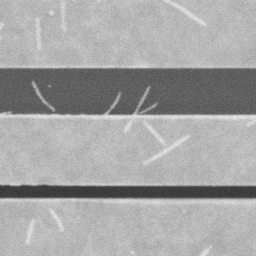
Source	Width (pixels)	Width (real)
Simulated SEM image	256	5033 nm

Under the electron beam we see lines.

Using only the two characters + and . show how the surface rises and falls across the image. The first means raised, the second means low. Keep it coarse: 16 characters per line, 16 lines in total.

++++++++++++++++
++++++++++++++++
++++++++++++++++
++++++++++++++++
................
................
................
++++++++++++++++
++++++++++++++++
++++++++++++++++
++++++++++++++++
++++++++++++++++
++++++++++++++++
++++++++++++++++
++++++++++++++++
++++++++++++++++